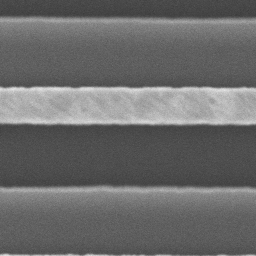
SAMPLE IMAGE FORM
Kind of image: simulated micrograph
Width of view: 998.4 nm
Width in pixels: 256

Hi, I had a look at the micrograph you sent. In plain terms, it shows lines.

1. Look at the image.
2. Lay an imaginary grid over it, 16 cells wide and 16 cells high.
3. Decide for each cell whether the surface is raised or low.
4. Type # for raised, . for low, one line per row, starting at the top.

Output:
................
################
################
################
################
################
################
################
................
................
................
................
################
################
################
################